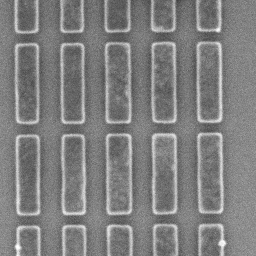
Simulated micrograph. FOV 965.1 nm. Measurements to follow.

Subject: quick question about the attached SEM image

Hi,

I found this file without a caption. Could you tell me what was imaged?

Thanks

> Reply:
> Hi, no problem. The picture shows wiring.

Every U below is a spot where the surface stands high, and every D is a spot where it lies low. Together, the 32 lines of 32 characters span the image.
DDUUUDDDUUDDDUUUDDDUUUDDDUUUDDDD
DDUUUDDDUUDDDUUUDDDUUUDDDUUUDDDD
DDUUUDDDUUDDDUUUDDDUUUDDDUUUDDDD
DDUUUDDDUUDDDUUUDDDUUUDDDUUDDDDD
DDDDDDDDDDDDDDDDDDDDDDDDDDDDDDDD
DDDDDDDDDUDDDDUUDDDUUUDDDUUDDDDD
DDUUUDDDUUDDDUUUDDDUUUDDDUUUDDDD
DDUUUDDDUUDDDUUUDDDUUUDDDUUUDDDD
DDUUUDDDUUDDDUUUDDDUUUDDDUUUDDDD
DDUUUDDDUUDDDUUUDDDUUUDDDUUUDDDD
DDUUUDDDUUDDDUUUDDDUUUDDDUUUDDDD
DDUUUDDDUUDDDUUUDDDUUUDDDUUUDDDD
DDUUUDDDUUDDDUUUDDDUUUDDDUUUDDDD
DDUUUDDDUUDDDUUUDDDUUUDDDUUUDDDD
DDUUUDDDUUUDDUUUDDDUUUDDDUUUDDDD
DDDDDDDDDDDDDDDDDDDDDDDDDDDDDDDD
DDDDDDDDDDDDDDDDDDDDDDDDDDDDDDDD
DDUUUDDDUUUDDUUUDDDUUUDDDUUUDDDD
DDUUUDDDUUUDDUUUDDDUUUDDDUUUDDDD
DDUUUDDDUUUDDUUUDDDUUUDDDUUUDDDD
DDUUUDDDUUUDDUUUDDDUUUDDDUUUDDDD
DDUUUDDDUUUDDUUUDDDUUUDDDUUUDDDD
DDUUUDDDUUUDDUUUDDDUUUDDDUUUDDDD
DDUUUDDDUUUDDUUUDDDUUUDDDUUUDDDD
DDUUUDDDUUUDDUUUDDDUUUDDDUUUDDDD
DDUUUDDDUUUDDUUUDDDUUUDDDUUUDDDD
DDUUUDDDUUDDDDUUDDDUUUDDDUUDDDDD
DDDDDDDDDDDDDDDDDDDDDDDDDDDDDDDD
DDUUUDDDUUUDDDUUDDDUUUDDDUUUDDDD
DDUUUDDDUUUDDDUUUDDUUUDDDUUUDDDD
DDUUUDDDUUUDDDUUUDDUUUDDDUUUDDDD
DDUUUDDDUUUDDDUUDDDUUUDDDUUUDDDD